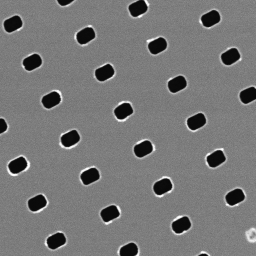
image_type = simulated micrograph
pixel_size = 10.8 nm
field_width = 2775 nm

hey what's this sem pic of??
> a regular array of holes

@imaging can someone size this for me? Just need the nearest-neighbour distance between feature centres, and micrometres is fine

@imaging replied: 0.458